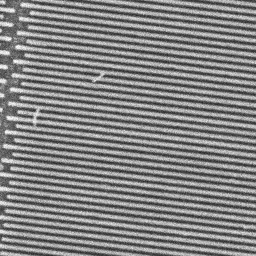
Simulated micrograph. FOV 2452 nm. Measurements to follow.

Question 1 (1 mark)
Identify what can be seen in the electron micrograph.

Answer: parallel lines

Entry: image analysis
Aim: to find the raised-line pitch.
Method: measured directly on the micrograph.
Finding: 0.0682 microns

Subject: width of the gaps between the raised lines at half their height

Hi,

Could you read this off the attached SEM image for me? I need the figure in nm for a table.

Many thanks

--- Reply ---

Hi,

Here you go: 35.6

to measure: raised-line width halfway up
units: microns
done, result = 0.0273